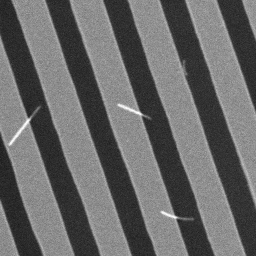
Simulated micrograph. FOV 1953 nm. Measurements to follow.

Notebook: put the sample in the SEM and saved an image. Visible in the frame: lines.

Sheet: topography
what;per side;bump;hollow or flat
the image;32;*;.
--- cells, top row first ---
..****...****...****...****...**
..****...****...****....****...*
..****...*****...****...****...*
...****...****...****...****...*
...****...****...****....****...
...****....****...****...****...
*...****...****...****...****...
*...****...****...****....****..
*...****....****...****...****..
**...****...****...****...****..
**...****...****...****....****.
**...*****...****...****...****.
***...****...****...****...****.
***...****...****...****....****
***...*****...****...****...****
****...****...****...****...****
****...****...****....****...***
****...****....****...****...***
.****...****...****...****...***
.****...****...****....****...**
.****...*****...****...****...**
..****...****...****...****....*
..****...****...****....***....*
..****....****...****...****...*
...****...****...****...****...*
...****...****...****....****...
...****....****...****...****...
*...****...****...****...****...
*...****...****...****....****..
**..****....****...****...****..
**...****...****...****...****..
**...****...****...****....****.